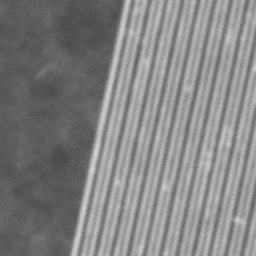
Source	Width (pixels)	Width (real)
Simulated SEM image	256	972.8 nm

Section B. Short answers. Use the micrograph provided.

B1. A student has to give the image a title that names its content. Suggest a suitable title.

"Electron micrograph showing parallel lines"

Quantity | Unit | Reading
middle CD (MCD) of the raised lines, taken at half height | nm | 16.3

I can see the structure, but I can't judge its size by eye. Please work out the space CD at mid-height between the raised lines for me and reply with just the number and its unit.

16.3 nanometres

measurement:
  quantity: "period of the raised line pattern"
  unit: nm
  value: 30.5